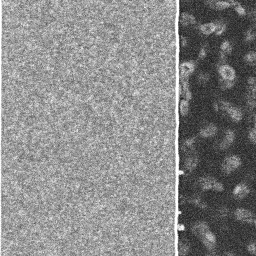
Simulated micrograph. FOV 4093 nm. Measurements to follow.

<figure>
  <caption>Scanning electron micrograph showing one or a few lines or trenches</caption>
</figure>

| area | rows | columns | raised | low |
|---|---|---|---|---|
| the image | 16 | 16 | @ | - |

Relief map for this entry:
@@@@@@@@@@@-----
@@@@@@@@@@@-----
@@@@@@@@@@@-----
@@@@@@@@@@@-----
@@@@@@@@@@@-----
@@@@@@@@@@@-----
@@@@@@@@@@@-----
@@@@@@@@@@@-----
@@@@@@@@@@@-----
@@@@@@@@@@@-----
@@@@@@@@@@@-----
@@@@@@@@@@@-----
@@@@@@@@@@@-----
@@@@@@@@@@@-----
@@@@@@@@@@@-----
@@@@@@@@@@@-----